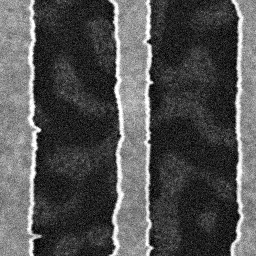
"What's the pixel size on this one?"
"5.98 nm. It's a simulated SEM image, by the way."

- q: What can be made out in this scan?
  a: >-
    one or a few lines or trenches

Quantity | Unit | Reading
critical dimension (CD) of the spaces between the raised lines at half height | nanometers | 527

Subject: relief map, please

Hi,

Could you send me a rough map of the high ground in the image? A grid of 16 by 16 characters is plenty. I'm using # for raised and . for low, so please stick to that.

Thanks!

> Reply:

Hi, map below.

##.....##......#
##.....##......#
##.....##......#
##.....##......#
##.....##......#
##.....##......#
##.....##......#
##......#......#
##......#......#
##.....##......#
##.....##......#
##.....##......#
##.....##......#
##.....##......#
##.....##......#
##.....##......#